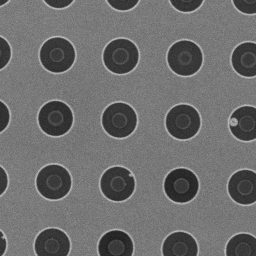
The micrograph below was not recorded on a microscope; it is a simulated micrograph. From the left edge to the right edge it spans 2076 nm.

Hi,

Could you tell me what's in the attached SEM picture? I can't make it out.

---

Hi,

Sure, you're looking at an array of small figures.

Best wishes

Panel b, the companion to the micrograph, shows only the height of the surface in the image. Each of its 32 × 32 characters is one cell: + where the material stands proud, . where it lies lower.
.+++++...+++++...++++....++++...
++++++++++++++++++++++++++++++..
++++++++++++++++++++++++++++++++
++++++++++++++++++++++++++++++++
++++++++++++++++++++++++++++++++
.++++....+++++...+++++..++++++..
.++++....++++....++++....++++...
.++++....++++....++++....++++...
++++++...++++....++++....++++...
+++++++++++++++++++++++.++++++..
++++++++++++++++++++++++++++++++
++++++++++++++++++++++++++++++++
++++++++++++++++++++++++++++++++
.++++....++++....+++++..++++++..
.++++....++++....++++....++++...
.++++....++++....++++....++++...
++++++..+++++....++++....++++...
++++++++++++++++++++++++++++++..
++++++++++++++++++++++++++++++++
++++++++++++++++++++++++++++++++
++++++++++++++++++++++++++++++++
.++++....++++...+++++...++++++..
.++++....++++....++++....++++...
.++++....++++....+++.....+++....
+++++...+++++...+++++...+++++...
++++++++++++++++++++++++++++++.+
++++++++++++++++++++++++++++++++
++++++++++++++++++++++++++++++++
++++++.+++++++++++++++++++++++++
.++++...+++++...+++++...+++++...
.+++.....+++.....+++.....+++....
.+++.....+++.....+++.....+++....